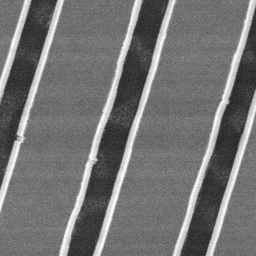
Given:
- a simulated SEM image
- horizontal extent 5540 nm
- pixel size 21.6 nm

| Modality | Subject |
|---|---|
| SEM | one or a few lines or trenches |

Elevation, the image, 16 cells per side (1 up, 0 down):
1100111110011111
1001111100111110
1001111100111110
1001111100111110
0011111000111110
0011111001111100
0011111001111100
0011110001111100
0111110011111001
0111110011111001
0111110011111001
1111100111110011
1111100111110011
1111100111110011
1111000111100011
1111001111100111